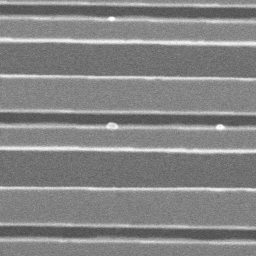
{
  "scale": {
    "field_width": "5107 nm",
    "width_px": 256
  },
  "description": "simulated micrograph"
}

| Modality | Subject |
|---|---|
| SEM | lines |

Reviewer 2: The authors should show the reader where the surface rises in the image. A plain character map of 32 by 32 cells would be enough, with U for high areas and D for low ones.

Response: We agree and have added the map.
DDDDDDDDDDDDDDDUUUUUUUUUUUUUUUUU
DDDDDDDDDDDDDDDDDDDDDDDDDDDDDDDD
UUUUUUUUUUUUUUUUUDDDDDDDDDDDDDDD
UUUUUUUUUUUUUUUUUUUUUUUUUUUUUUUU
UUUUUUUUUUUUUUUUUUUUUUUUUUUUUUUU
DDDDDDDDDDDDDDDDDDDDDDDDDDDDDDDD
DDDDDDDDDDDDDDDDDDDDDDDDDDDDDDDD
DDDDDDDDDDDDDDDDDDDDDDDDDDDDDDDD
DDDDDDDDDDDDDDDDDDDDDDDDDDDDDDDD
UDDDDDDDDDDDDDDDDDDDDDDDDDDDDDDD
UUUUUUUUUUUUUUUUUUUUUUUUUUUUUUUU
UUUUUUUUUUUUUUUUUUUUUUUUUUUUUUUU
UUUUUUUUUUUUUUUUUUUUUUUUUUUUUUUU
UUUUUUUUUUUUUUUUUUUUUUUUUUUUUUUU
DDDDDDDDDDDDDDDDDDDDDDDDDDDDDDDD
DDDDDDDDDDDDDDDDDDDDDDDDDDDDDDDD
UUUUUUUUUUUUUUUUUUUUUUUUUUUUUUUU
UUUUUUUUUUUUUUUUUUUUUUUUUUUUUUUU
DDDDDDDUUUUUUUUUUUUUUUUUUUUUUUUU
DDDDDDDDDDDDDDDDDDDDDDDDDDDDDDDD
DDDDDDDDDDDDDDDDDDDDDDDDDDDDDDDD
DDDDDDDDDDDDDDDDDDDDDDDDDDDDDDDD
DDDDDDDDDDDDDDDDDDDDDDDDDDDDDDDD
DDDDDDDDDDDDDDDDDDDDDDDDDDDDDDDD
UUUUUUUUUUUUUUUUUUUUUUUUUUUUUUUU
UUUUUUUUUUUUUUUUUUUUUUUUUUUUUUUU
UUUUUUUUUUUUUUUUUUUUUUUUUUUUUUUU
UUUUUUUUUUUUUUUUUUUUUUUUUUUUUUUU
DDDDDDDDDDDDDDDDDDDDDDDDDDDDUUUU
DDDDDDDDDDDDDDDDDDDDDDDDDDDDDDDD
UUUUUUUUUUUUUUUUUUUUUUUUUUUUUUUU
UUUUUUUUUUUUUUUUUUUUUUUUUUUUUUUU